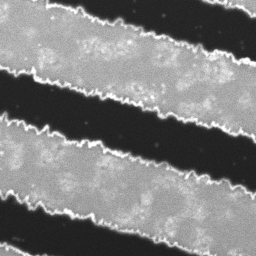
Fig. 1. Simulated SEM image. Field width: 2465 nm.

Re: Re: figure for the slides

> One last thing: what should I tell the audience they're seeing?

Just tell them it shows one or a few lines or trenches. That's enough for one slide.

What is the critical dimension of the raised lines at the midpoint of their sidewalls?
496 nanometres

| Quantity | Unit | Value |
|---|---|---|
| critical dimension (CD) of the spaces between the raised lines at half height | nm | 672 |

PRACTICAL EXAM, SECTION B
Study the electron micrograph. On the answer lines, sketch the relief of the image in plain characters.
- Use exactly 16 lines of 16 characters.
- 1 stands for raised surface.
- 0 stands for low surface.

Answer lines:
0000111111111110
0000000011111111
0000000000011111
0000000000000011
1100000000000000
1111100000000000
1111111110000000
1111111111110000
0000111111111111
0000000111111111
0000000000011111
0000000000000011
1100000000000000
1111100000000000
1111111110000000
0111111111110000